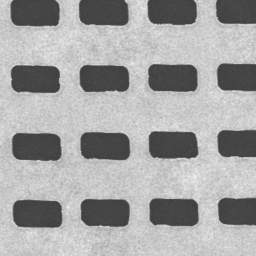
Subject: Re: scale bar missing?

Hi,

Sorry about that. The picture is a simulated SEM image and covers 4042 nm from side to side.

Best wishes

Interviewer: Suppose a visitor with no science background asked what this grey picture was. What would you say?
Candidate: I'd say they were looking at a regular array of holes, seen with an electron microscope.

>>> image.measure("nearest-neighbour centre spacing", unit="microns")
1.06